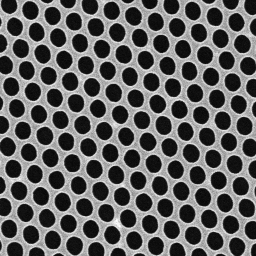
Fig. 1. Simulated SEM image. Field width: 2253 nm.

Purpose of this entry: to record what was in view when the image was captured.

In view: a regular array of holes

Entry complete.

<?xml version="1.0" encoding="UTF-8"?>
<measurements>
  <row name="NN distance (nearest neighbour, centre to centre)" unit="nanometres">197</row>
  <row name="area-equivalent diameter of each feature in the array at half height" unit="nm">154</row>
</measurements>